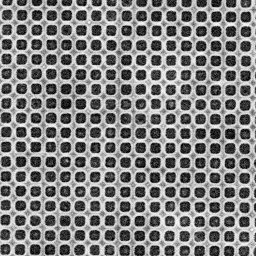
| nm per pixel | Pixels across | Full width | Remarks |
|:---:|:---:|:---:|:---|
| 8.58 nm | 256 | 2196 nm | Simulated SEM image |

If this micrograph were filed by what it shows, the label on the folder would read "a regular array of holes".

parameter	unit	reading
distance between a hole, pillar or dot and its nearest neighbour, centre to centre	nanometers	124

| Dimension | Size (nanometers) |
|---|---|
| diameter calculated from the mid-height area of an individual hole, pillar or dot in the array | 104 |